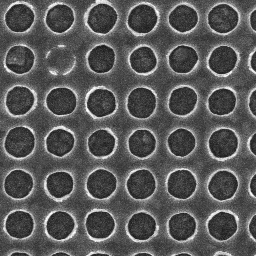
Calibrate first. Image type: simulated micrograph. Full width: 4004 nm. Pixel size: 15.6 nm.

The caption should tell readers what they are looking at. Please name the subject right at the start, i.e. a regular array of holes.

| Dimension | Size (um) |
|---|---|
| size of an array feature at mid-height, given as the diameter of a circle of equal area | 0.451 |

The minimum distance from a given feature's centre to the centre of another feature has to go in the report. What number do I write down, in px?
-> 40.1